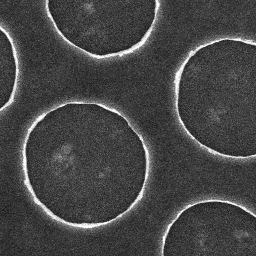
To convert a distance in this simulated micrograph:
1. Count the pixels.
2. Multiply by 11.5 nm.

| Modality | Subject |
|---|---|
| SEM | holes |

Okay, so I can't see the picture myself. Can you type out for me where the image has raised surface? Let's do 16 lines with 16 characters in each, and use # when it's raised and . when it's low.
###.......######
###.......######
.###.....#######
.###########....
.##########.....
.##########.....
####..#####.....
##......###.....
##.......###....
##.......#####..
##.......#######
##.......#######
##......########
###....####.....
###########.....
##########......